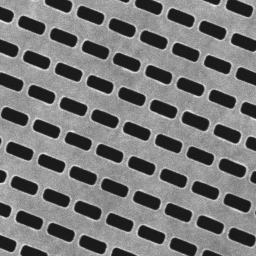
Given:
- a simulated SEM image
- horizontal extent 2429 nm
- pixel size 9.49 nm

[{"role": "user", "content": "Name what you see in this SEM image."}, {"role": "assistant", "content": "a regular array of holes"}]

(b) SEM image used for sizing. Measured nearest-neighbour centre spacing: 322 nanometers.